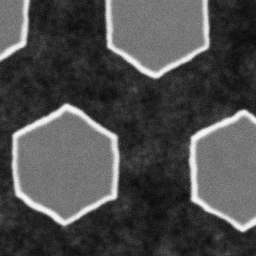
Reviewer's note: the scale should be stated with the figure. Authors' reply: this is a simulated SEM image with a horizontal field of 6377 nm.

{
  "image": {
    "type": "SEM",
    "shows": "raised bodies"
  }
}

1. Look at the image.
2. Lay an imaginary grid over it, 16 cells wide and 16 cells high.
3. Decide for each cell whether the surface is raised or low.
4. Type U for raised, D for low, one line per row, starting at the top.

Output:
UUDDDDDUUUUUUDDD
UUDDDDDUUUUUUDDD
UDDDDDDUUUUUUDDD
DDDDDDDDUUUUDDDD
DDDDDDDDDUDDDDDD
DDDDDDDDDDDDDDDD
DDDDDDDDDDDDDDDD
DDDUUUDDDDDDDDUU
DUUUUUUDDDDDUUUU
DUUUUUUDDDDDUUUU
DUUUUUUDDDDDUUUU
DUUUUUUDDDDDUUUU
DDUUUUUDDDDDUUUU
DDDUUDDDDDDDDDUU
DDDDDDDDDDDDDDDD
DDDDDDDDDDDDDDDD